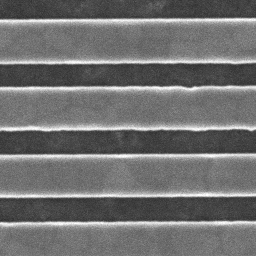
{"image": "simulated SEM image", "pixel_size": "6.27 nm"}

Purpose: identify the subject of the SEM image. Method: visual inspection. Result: one or a few lines or trenches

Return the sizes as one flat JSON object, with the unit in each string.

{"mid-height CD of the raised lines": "0.267 microns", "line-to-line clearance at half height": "157 nm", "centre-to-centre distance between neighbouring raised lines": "0.421 µm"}